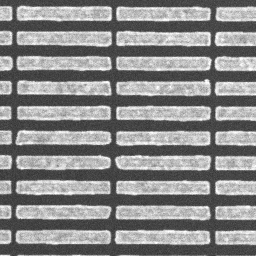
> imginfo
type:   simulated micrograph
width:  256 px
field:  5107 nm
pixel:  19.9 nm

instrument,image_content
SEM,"wiring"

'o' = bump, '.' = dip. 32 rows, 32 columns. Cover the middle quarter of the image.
oooooooooooo..oooooooooooooooooo
................................
................................
................................
................................
ooooooooooo...oooooooooooooooooo
ooooooooooo...oooooooooooooooooo
..........................oooooo
................................
................................
................................
ooooooooooo...oooooooooooooooooo
ooooooooooo...oooooooooooooooooo
ooooooooooo...oooooooooooooooooo
................................
................................
................................
ooooooooooo...oooooooooooooooooo
ooooooooooo..ooooooooooooooooooo
ooooooooooo..ooooooooooooooooooo
................................
................................
................................
oooooooooo...ooooooooooooooooooo
ooooooooooo..ooooooooooooooooooo
ooooooooooo...oooooooooooooooooo
................................
................................
................................
ooooooo...........ooooooo.......
ooooooooooo...oooooooooooooooooo
ooooooooooo...oooooooooooooooooo